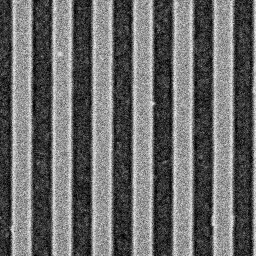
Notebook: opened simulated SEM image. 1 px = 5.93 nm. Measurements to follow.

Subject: parallel lines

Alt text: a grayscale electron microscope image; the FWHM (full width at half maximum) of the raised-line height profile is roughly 121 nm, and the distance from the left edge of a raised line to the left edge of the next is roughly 238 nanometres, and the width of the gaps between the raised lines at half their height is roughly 121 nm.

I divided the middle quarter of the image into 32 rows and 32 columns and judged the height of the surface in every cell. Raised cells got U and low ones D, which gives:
UUDDDDDUUUUUDDDDDUUUUUDDDDDUUUUU
UUDDDDDUUUUUDDDDDUUUUUDDDDDUUUUU
UUDDDDDUUUUUDDDDDUUUUUDDDDDUUUUU
UUDDDDDUUUUUDDDDDUUUUUDDDDDUUUUU
UUDDDDDUUUUUDDDDDUUUUUDDDDDUUUUU
UUDDDDDUUUUUDDDDDUUUUUDDDDDUUUUU
UUDDDDDUUUUUDDDDDUUUUUDDDDDUUUUU
UUDDDDDUUUUUDDDDDUUUUUDDDDDUUUUU
UUDDDDDUUUUUDDDDDUUUUUDDDDDUUUUU
UUDDDDDUUUUUDDDDDUUUUUDDDDDUUUUU
UUDDDDDUUUUUDDDDDUUUUUDDDDDUUUUU
UUDDDDDUUUUUDDDDDUUUUUDDDDDUUUUU
UUDDDDDUUUUUDDDDDUUUUUDDDDDUUUUU
UUDDDDDUUUUUDDDDDUUUUUDDDDDUUUUU
UUDDDDDUUUUUDDDDDUUUUUDDDDDUUUUU
UUDDDDDUUUUUDDDDDUUUUUDDDDDUUUUU
UUDDDDDUUUUUDDDDDUUUUUDDDDDUUUUU
UUDDDDDUUUUUDDDDDUUUUUDDDDDUUUUU
UUDDDDDUUUUUDDDDDUUUUUDDDDDUUUUU
UUDDDDDUUUUUDDDDDUUUUUDDDDDUUUUU
UUDDDDDUUUUUDDDDDUUUUUDDDDDUUUUU
UUDDDDDUUUUUDDDDDUUUUUDDDDDUUUUU
UUDDDDDUUUUUDDDDDUUUUUDDDDDUUUUU
UUDDDDDUUUUUDDDDDUUUUUDDDDDUUUUU
UUDDDDDUUUUUDDDDDUUUUUDDDDDUUUUU
UUDDDDDUUUUUDDDDDUUUUUDDDDDUUUUU
UUDDDDDUUUUUDDDDDUUUUUDDDDDUUUUU
UUDDDDDUUUUUDDDDDUUUUUDDDDDUUUUU
UUDDDDDUUUUUDDDDDUUUUUDDDDDUUUUU
UUDDDDDUUUUUDDDDDUUUUUDDDDDUUUUU
UUDDDDDUUUUUDDDDDUUUUUDDDDDUUUUU
UUDDDDDUUUUUDDDDDUUUUUDDDDDUUUUU